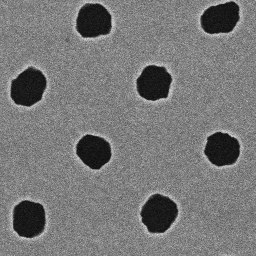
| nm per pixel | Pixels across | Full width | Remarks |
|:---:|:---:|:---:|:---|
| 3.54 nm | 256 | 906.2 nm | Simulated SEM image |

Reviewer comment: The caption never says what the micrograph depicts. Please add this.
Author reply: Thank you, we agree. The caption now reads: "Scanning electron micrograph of a regular array of holes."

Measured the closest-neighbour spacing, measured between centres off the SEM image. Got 319 nanometres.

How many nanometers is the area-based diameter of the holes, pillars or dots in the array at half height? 124